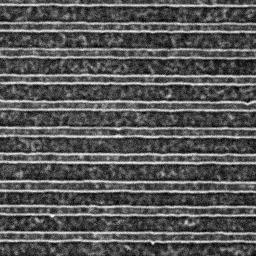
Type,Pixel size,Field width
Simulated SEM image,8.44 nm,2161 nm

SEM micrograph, parallel lines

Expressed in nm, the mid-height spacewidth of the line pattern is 151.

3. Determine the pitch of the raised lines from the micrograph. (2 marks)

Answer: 221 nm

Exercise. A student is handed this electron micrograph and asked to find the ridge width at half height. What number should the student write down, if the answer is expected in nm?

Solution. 75.9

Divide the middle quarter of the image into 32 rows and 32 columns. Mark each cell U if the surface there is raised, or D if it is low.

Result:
DDDDDDDDDDDDDDDDDDDDDDDDDDDDDDDD
DDDDDDDDDDDDDDDDDDDDDDDDDDDDDDDD
DDDDDDDDDDDDDDDDDDDDDDDDDDDDDDDD
UUUUUUUUUUUUUUUUUUUUUUUUUUUUUUUU
UUUUUUUUUUUUUUUUUUUUUUUUUUUUUUUU
DDDDDDDDDDDDDDDDDDDDDDDDDDDDDDDD
DDDDDDDDDDDDDDDDDDDDDDDDDDDDDDDD
DDDDDDDDDDDDDDDDDDDDDDDDDDDDDDDD
DDDDDDDDDDDDDDDDDDDDDDDDDDDDDDDD
UUUUUUUDUUUUUUUUUUUUDDUUUDDDDDDD
UUUUUUUUUUUUUUUUUUUUUUUUUUUUUUUU
DDDDDDDDDDDDDDDDDDDDDDDDDDUUUUUU
DDDDDDDDDDDDDDDDDDDDDDDDDDDDDDDD
DDDDDDDDDDDDDDDDDDDDDDDDDDDDDDDD
DDDDDDDDDDDDDDDDDDDDDDDDDDDDDDDD
DDDDDDDDDDDDDDDDDDDDDDDDDDDDDDDD
UUUUUUUUUUUUUUUUUUUUUUUUUUUUUUUU
UUUUUUUUUUUUUUUUUUUUUUUUUUUUUUUU
DDDDDDDDDDDDDDDDDDDDDDDDDDDDDDDD
DDDDDDDDDDDDDDDDDDDDDDDDDDDDDDDD
DDDDDDDDDDDDDDDDDDDDDDDDDDDDDDDD
DDDDDDDDDDDDDDDDDDDDDDDDDDDDDDDD
DDDDDDDDDDDDDDDDDDDDUUDDDDDDDDDD
UUUUUUUUUUUUUUUUUUUUUUUUUUUUUUUU
UUUUUUUUUUUUUUUUUUUUUUUUUUUUUUUU
DDDDDDDDDDDDDDDDDDDDDDDDDDDDDDDD
DDDDDDDDDDDDDDDDDDDDDDDDDDDDDDDD
DDDDDDDDDDDDDDDDDDDDDDDDDDDDDDDD
DDDDDDDDDDDDDDDDDDDDDDDDDDDDDDDD
DUDDUUUUUUUUDDDDDDDUDDDDUDDDDDUU
UUUUUUUUUUUUUUUUUUUUUUUUUUUUUUUU
UUUUUUUUUUUUUUUUUUUUUUUUUUUUUUUU